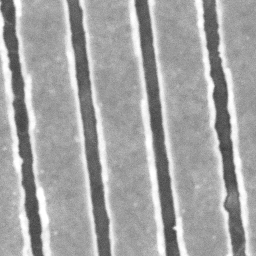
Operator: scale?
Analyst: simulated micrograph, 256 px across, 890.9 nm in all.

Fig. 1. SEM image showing one or a few lines or trenches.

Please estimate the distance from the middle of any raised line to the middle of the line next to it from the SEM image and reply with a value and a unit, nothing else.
233 nanometers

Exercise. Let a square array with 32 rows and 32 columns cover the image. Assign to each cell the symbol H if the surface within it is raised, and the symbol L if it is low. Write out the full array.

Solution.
LLHHHHHHLLHHHHHHHLLHHHHHHLLHHHHH
LLHHHHHHLLHHHHHHHLLHHHHHHLLHHHHH
LLHHHHHHLLHHHHHHHLLHHHHHHLLHHHHH
LLHHHHHHHLLHHHHHHLLHHHHHHLLHHHHH
LLHHHHHHHLLHHHHHHLLHHHHHHHLLHHHH
LLLHHHHHHLLHHHHHHLLHHHHHHHLLHHHH
HLLHHHHHHLLHHHHHHLLHHHHHHHLLHHHH
HLLHHHHHHLLHHHHHHHLLHHHHHHLLHHHH
HLLHHHHHHLLHHHHHHHLLHHHHHHLLHHHH
HLLHHHHHHLLHHHHHHHLLHHHHHHLLHHHH
HLLHHHHHHLLHHHHHHHLLHHHHHHHLHHHH
HLLHHHHHHHLLHHHHHHLLHHHHHHHLLHHH
HLLHHHHHHHLLHHHHHHLLHHHHHHHLLHHH
HLLHHHHHHHLLHHHHHHLLHHHHHHHLLHHH
HHLLHHHHHHLLHHHHHHLLHHHHHHHLLHHH
HHLLHHHHHHLLHHHHHHHLLHHHHHHLLHHH
HHLLHHHHHHLLHHHHHHHLLHHHHHHLLHHH
HHLLHHHHHHLLHHHHHHHLLHHHHHHLLHHH
HHLLHHHHHHHLLHHHHHHLLHHHHHHLLHHH
HHLLHHHHHHLLLHHHHHHLLHHHHHHHLHHH
HHLLHHHHHHHLLHHHHHHLLHHHHHHHLHHH
HHHLHHHHHHHLLHHHHHHLLHHHHHHHLLHH
HHHLHHHHHHHLLHHHHHHLLLHHHHHHLLHH
HHHLLHHHHHHLLHHHHHHHLLHHHHHHLLHH
HHHLLHHHHHHLLHHHHHHHLLHHHHHHLLHH
HHHLLHHHHHHLLHHHHHHHLLHHHHHHLLHH
HHHLLHHHHHHLLLHHHHHHLLHHHHHHLLHH
HHHLLHHHHHHHLLHHHHHHLLHHHHHHLLHH
HHHLLHHHHHHHLLHHHHHHLLHHHHHHLLLH
HHHLLHHHHHHHLLHHHHHHLLHHHHHHHLLH
HHHHLLHHHHHHLLHHHHHHLLHHHHHHHLLH
HHHHLLHHHHHHLLHHHHHHHLLHHHHHHLLH